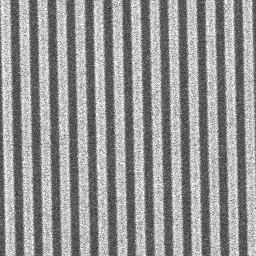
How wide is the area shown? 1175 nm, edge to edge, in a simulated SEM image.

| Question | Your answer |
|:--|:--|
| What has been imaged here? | parallel lines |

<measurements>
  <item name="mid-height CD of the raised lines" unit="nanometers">46.5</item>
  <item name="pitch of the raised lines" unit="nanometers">85.4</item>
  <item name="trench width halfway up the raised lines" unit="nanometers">37.9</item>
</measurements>